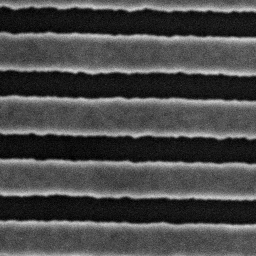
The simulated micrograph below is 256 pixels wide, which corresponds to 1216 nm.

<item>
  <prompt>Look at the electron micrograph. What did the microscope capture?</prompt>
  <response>lines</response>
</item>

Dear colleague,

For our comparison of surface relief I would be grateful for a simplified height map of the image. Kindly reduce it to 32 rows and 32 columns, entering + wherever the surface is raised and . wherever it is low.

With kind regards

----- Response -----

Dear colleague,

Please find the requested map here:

++++++++++++++++++++++++++++++++
............................+...
................................
................................
++++++++++++++++++++............
++++++++++++++++++++++++++++++++
++++++++++++++++++++++++++++++++
++++++++++++++++++++++++++++++++
++++++++++++++++++++++++++++++++
................................
................................
................................
++++++++++++++++++++++++........
++++++++++++++++++++++++++++++++
++++++++++++++++++++++++++++++++
++++++++++++++++++++++++++++++++
++++++++++++++++++++++++++++++++
................................
................................
................................
+++++++++++++++++++++++++++.+++.
++++++++++++++++++++++++++++++++
++++++++++++++++++++++++++++++++
++++++++++++++++++++++++++++++++
..+......+++++++++++++++++++++++
................................
................................
................................
++++++++++++++++++++++++++++++++
++++++++++++++++++++++++++++++++
++++++++++++++++++++++++++++++++
++++++++++++++++++++++++++++++++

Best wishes